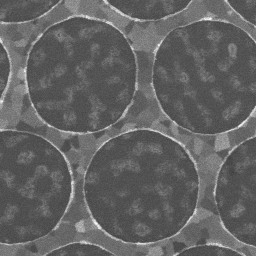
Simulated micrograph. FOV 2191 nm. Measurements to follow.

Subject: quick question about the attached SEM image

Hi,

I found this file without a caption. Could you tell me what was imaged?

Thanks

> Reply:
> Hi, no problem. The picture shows holes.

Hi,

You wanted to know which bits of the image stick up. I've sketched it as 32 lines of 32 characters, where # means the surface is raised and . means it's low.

.......#######..........#####...
......#########.......########..
....####....######.######.#####.
######........########........##
#####...........#####..........#
####............####............
.###.............###............
.##..............##.............
.##..............##.............
.##..............##.............
.##..............##.............
####.............##.............
####.............###............
####............####............
#####..........######..........#
######........########........##
...######...####....####....####
......########........#########.
.......######..........######...
........####............#####...
........###.............####....
.........##..............##.....
.........##..............##.....
.........#...............##.....
.........##..............##.....
.........##..............##.....
........###.............###.....
........####............####....
.......######..........#####....
.....#########........#######...
#.#######..####################.
######........#########.......##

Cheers